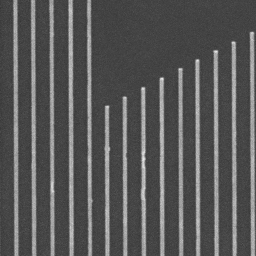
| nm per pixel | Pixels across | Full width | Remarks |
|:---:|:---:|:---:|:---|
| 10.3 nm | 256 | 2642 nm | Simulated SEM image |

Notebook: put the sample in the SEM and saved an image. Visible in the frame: parallel lines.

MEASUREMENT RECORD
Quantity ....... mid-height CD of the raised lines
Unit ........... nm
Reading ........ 36.1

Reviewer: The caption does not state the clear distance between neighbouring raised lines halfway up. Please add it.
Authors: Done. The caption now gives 0.155 micrometres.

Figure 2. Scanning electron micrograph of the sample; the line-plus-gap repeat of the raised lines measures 188 nm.